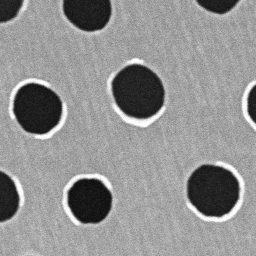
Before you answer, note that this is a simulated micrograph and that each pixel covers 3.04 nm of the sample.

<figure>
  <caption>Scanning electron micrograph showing holes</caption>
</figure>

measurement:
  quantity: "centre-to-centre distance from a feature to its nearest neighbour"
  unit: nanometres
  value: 317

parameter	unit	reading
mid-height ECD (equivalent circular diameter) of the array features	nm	154